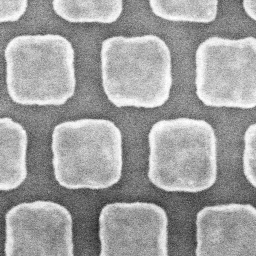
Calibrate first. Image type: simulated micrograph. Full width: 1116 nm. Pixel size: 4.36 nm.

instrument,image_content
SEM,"raised bodies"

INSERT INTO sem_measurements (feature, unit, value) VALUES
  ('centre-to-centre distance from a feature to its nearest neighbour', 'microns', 0.418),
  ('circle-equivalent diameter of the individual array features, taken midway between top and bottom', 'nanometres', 318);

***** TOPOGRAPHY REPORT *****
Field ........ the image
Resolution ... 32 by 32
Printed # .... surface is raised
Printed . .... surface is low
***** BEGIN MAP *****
###....########....########....#
###....########.....#######....#
........######..........##......
................................
....#...........................
.########....#######......######
.########....########....#######
.########....########....#######
.########....########....#######
.########....########....#######
.########....########....#######
.########....########....#######
..######......######.....#######
................................
................................
##......######......######......
###....########....#######.....#
###....########....########....#
###....########....########....#
###....########....########....#
###....########....########....#
###....########....########....#
##.....########....########....#
.........#.##.......######......
................................
....###.......#####.............
.#######.....#######.....#######
.########...#########....#######
.########...#########....#######
.########...#########....#######
.########....#######.....#######
.########....########....#######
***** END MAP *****